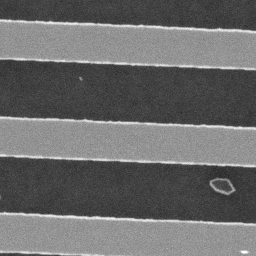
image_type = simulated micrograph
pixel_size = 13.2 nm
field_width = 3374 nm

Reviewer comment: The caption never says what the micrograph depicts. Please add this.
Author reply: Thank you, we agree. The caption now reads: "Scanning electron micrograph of lines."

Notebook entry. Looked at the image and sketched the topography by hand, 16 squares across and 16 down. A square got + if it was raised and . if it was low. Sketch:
................
++++++..........
++++++++++++++++
++++++++++++++++
................
................
................
+++++...........
++++++++++++++++
++++++++++++++++
................
................
................
++++............
++++++++++++++++
++++++++++++++++